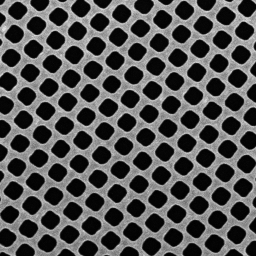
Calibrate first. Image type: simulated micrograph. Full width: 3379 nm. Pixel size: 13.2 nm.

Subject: a regular array of holes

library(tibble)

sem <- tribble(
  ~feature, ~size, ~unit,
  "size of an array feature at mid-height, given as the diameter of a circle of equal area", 241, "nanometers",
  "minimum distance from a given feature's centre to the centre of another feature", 312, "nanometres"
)